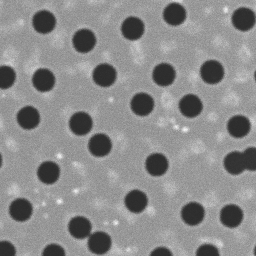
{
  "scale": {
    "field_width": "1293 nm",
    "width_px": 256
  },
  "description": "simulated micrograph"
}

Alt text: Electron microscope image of a regular array of holes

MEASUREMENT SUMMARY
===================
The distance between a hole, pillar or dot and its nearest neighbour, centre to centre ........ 0.204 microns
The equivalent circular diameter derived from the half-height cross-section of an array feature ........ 0.124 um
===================